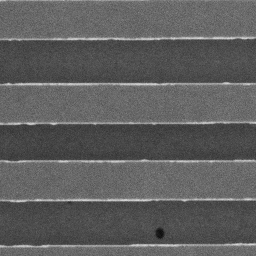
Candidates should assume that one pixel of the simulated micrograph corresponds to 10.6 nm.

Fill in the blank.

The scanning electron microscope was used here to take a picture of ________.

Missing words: lines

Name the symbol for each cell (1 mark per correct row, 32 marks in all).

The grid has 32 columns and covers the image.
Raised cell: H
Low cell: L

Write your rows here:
HHHHHHHHHHHHHHHHHHHHHHHHHHHHHHHH
HHHHHHHHHHHHHHHHHHHHHHHHHHHHHHHH
HHHHHHHHHHHHHHHHHHHHHHHHHHHHHHHH
HHHHHHHHHHHHHHHHHHHHHHHHHHHHHHHH
HHHHHHHHHHHHHHHHHHHHHHHHHHHHHHHH
LLLLLLLLLLLLLLLLLLLLLLLLLLLLLLLL
LLLLLLLLLLLLLLLLLLLLLLLLLLLLLLLL
LLLLLLLLLLLLLLLLLLLLLLLLLLLLLLLL
LLLLLLLLLLLLLLLLLLLLLLLLLLLLLLLL
LLLLLLLLLLLLLLLLLLLLLLLLLLLLLLLL
HHHHHHHHHHHHHHHHHHHHHHHHHHHHHHHH
HHHHHHHHHHHHHHHHHHHHHHHHHHHHHHHH
HHHHHHHHHHHHHHHHHHHHHHHHHHHHHHHH
HHHHHHHHHHHHHHHHHHHHHHHHHHHHHHHH
HHHHHHHHHHHHHHHHHHHHHHHHHHHHHHHH
HHHHHLHLLLLLLLLLLLLHLLLLLLLLLLLL
LLLLLLLLLLLLLLLLLLLLLLLLLLLLLLLL
LLLLLLLLLLLLLLLLLLLLLLLLLLLLLLLL
LLLLLLLLLLLLLLLLLLLLLLLLLLLLLLLL
LLLLLLLLLLLLLLLLLLLLLLLLLLLLLLLL
HHHHHHHHHHHHHHHHHHHHHHHHHHHHHHHH
HHHHHHHHHHHHHHHHHHHHHHHHHHHHHHHH
HHHHHHHHHHHHHHHHHHHHHHHHHHHHHHHH
HHHHHHHHHHHHHHHHHHHHHHHHHHHHHHHH
HHHHHHHHHHHHHHHHHHHHHHHHHHHHHHHH
LLLLLLLLLLLLLLLLLLLLLLLLLLLLLLLL
LLLLLLLLLLLLLLLLLLLLLLLLLLLLLLLL
LLLLLLLLLLLLLLLLLLLLLLLLLLLLLLLL
LLLLLLLLLLLLLLLLLLLLLLLLLLLLLLLL
LLLLLLLLLLLLLLLLLLLLLLLLLLLLLLLL
LLLLLLLLLLLLLLLLLLLLLLLLLLLLLLLL
HHHHHHHHHHHHHHHHHHHHHHHHHHHHHHHH